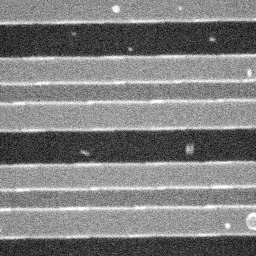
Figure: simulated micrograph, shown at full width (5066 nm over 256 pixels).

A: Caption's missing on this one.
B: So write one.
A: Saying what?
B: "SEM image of lines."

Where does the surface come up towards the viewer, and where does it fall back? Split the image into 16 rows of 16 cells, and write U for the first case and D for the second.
UUUUUUUUUUUUUUUU
DDDDDDDDDDDDDDDD
DDDDDDDDDDDDDDDD
DDDDDDDDDDDDDDDD
UUUUUUUUUUUUUUUU
UUUUUUUUUUUUUUUU
UUUUUUUUUUUUUUUU
UUUUUUUUUUUUUUUU
DDDDDDDDDDDDDDDD
DDDDDDDDDDDDDDDD
UUUUUUUUUUUUUUUU
UUUUUUUUUUUUUUUU
UUUUUUUUUUUUUUUU
UUUUUUUUUUUUUUUU
UUUUUUUUUUUUUUUU
DDDDDDDDDDDDDDDD